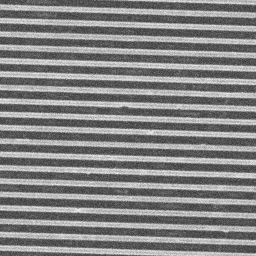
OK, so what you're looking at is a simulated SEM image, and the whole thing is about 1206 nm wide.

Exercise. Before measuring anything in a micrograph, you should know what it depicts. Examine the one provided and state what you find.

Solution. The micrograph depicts parallel lines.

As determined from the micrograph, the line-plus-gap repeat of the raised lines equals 63.1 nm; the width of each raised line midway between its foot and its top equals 0.0224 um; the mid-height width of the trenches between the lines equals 40.1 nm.